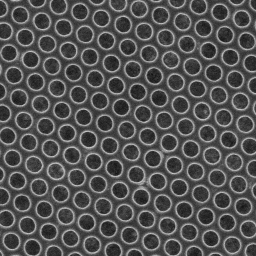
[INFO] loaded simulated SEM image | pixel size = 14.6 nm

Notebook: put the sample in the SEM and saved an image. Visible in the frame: a regular array of holes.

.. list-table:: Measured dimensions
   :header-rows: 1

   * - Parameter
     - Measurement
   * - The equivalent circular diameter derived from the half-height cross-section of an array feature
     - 227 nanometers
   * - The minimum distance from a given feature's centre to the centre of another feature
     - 324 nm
